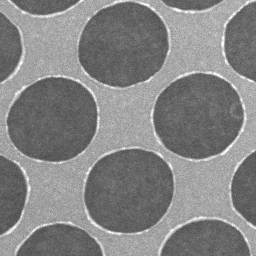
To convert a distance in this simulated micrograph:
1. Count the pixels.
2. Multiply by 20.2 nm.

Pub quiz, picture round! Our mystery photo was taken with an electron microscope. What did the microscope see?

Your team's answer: holes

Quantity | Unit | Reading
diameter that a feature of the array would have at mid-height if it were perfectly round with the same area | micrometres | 1.8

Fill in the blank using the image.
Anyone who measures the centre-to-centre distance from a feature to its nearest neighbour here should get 2070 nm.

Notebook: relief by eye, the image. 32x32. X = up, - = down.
XX-------XXXXX----XXX------XXXX-
XXX-----XXXX-------XXXXXXXXXXX--
-XXXXXXXXXX---------XXXXXXXXX---
--XXXXXXXX-----------XXXXXXX----
---XXXXXXX-----------XXXXXXX----
---XXXXXXX-----------XXXXXXX----
---XXXXXXX-----------XXXXXXX----
---XXXXXXX-----------XXXXXXX----
--XXXXXXXX----------XXXXXXXXX---
-XXXXXXXXXX--------XXXX----XXX--
XXXX------XXX----XXXX--------XXX
XXX--------XXXXXXXXX----------XX
XX----------XXXXXXXX----------XX
X-----------XXXXXXX-----------XX
X-----------XXXXXXX------------X
X-----------XXXXXXX-----------XX
X-----------XXXXXXX-----------XX
X-----------XXXXXXXX---------XXX
XX---------XXXXXXXXXX-------XXXX
XXX-------XXX-------XX-----XXXX-
--XXXXXXXXXX---------XXXXXXXXX--
---XXXXXXXX-----------XXXXXXX---
---XXXXXXXX-----------XXXXXXX---
---XXXXXXX------------XXXXXXX---
---XXXXXXX------------XXXXXXX---
---XXXXXXXX----------XXXXXXXX---
---XXXXXXXX----------XXXXXXXXX--
--XXXXXXXXXX--------XXXXX--XXXX-
-XXXX-----XXX------XXX--------XX
XXXX-------XXXXXXXXXX---------XX
XXX---------XXXXXXXX-----------X
XX-----------XXXXXXX-----------X